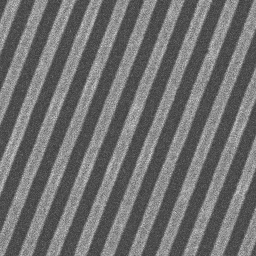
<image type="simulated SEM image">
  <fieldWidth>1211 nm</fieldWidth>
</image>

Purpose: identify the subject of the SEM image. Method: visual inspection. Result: parallel lines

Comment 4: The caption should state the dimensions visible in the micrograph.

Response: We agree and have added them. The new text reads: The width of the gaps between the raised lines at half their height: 66.3 nm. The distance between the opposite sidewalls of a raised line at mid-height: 0.0536 µm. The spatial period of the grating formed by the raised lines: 0.121 microns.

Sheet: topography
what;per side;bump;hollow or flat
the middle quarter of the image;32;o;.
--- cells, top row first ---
ooo....ooo....ooo....ooo....ooo.
ooo....ooo....ooo...ooo....ooo..
ooo...ooo....ooo....ooo....ooo..
oo....ooo....ooo....ooo...ooo...
oo....ooo...ooo....ooo....ooo...
o....ooo....ooo....ooo....ooo...
o....ooo....ooo...ooo....ooo....
o...ooo....ooo....ooo....ooo....
....ooo....ooo....ooo....oo....o
....ooo...ooo....ooo....ooo....o
...ooo....ooo....ooo....ooo...oo
...ooo....ooo....ooo...ooo....oo
...ooo...ooo....ooo....ooo....oo
..ooo....ooo....ooo....ooo....oo
..ooo....ooo...oooo...ooo....ooo
.ooo....ooo....ooo....ooo....ooo
.ooo....ooo....ooo....oo....ooo.
.ooo...ooo....ooo....ooo....ooo.
ooo....ooo....ooo....ooo...oooo.
ooo....ooo...ooo....ooo....ooo..
oo....ooo....ooo....ooo....ooo..
oo....ooo....ooo...ooo....ooo...
o....ooo....ooo....ooo....ooo...
o....ooo....ooo....ooo....oo....
o....ooo...ooo....ooo....ooo....
o...ooo....ooo....ooo....ooo...o
....ooo....ooo....ooo...ooo....o
....ooo...ooo....ooo....ooo....o
...ooo....ooo....ooo....ooo....o
...ooo....ooo...ooo....ooo....oo
..ooo....ooo....ooo....ooo....oo
..ooo....ooo....ooo...ooo....ooo